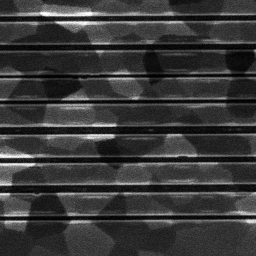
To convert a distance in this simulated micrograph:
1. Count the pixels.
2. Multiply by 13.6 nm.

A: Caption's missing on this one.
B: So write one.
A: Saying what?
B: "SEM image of parallel lines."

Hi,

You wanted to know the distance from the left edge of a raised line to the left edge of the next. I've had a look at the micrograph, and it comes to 389 nm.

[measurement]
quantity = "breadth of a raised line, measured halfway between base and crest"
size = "297 nanometres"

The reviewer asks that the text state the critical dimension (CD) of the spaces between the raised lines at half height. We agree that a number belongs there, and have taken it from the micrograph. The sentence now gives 93.8 nanometres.